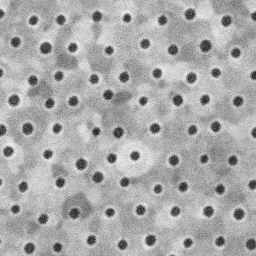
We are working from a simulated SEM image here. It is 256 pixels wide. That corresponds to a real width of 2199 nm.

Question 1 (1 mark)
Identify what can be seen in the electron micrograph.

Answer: a regular array of holes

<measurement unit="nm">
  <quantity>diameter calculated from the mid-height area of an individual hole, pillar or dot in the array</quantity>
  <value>102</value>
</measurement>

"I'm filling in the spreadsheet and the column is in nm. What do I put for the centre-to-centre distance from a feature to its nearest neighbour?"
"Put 235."